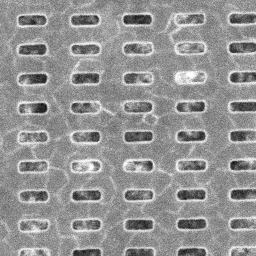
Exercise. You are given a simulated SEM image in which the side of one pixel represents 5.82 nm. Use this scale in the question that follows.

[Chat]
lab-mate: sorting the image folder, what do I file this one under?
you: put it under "a regular array of holes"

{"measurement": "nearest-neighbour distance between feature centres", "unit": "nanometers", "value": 169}